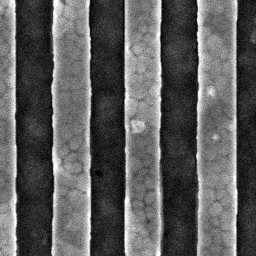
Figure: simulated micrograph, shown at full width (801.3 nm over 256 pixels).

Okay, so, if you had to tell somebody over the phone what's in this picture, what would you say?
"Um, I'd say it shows lines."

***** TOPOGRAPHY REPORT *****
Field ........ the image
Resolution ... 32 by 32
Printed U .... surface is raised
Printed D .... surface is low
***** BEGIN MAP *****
UUDDDDDUUUUDDDDDUUUUDDDDDUUUUUDD
UUDDDDDUUUUDDDDDUUUUDDDDDUUUUUDD
UUDDDDDUUUUDDDDDUUUUDDDDDUUUUUDD
UUDDDDDUUUUDDDDDUUUUDDDDDUUUUDDD
UUDDDDDUUUUDDDDDUUUUDDDDDUUUUDDD
UUDDDDDUUUUDDDDDUUUUDDDDDUUUUDDD
UUDDDDDUUUUDDDDDUUUUDDDDDUUUUDDD
UUDDDDDUUUUDDDDDUUUUDDDDDUUUUDDD
UUDDDDDUUUUDDDDDUUUUDDDDDUUUUDDD
UUDDDDDUUUUDDDDDUUUUDDDDDUUUUDDD
UUDDDDDUUUUDDDDDUUUUDDDDDUUUUDDD
UUDDDDDUUUUDDDDDUUUUDDDDDUUUUDDD
UUDDDDDUUUUDDDDDUUUUDDDDDUUUUDDD
UUDDDDDUUUUDDDDDUUUUDDDDDUUUUDDD
UUDDDDDUUUUDDDDDUUUUDDDDDUUUUDDD
UUDDDDDUUUUDDDDDUUUUDDDDDUUUUDDD
UUDDDDDUUUUDDDDDUUUUDDDDDUUUUDDD
UUDDDDDUUUUDDDDDUUUUDDDDDUUUUDDD
UUDDDDDUUUUDDDDDUUUUDDDDDUUUUDDD
UUDDDDDUUUUDDDDDUUUUDDDDDUUUUDDD
UUDDDDDUUUUDDDDDUUUUDDDDDUUUUDDD
UUDDDDDUUUUDDDDDUUUUDDDDDUUUUDDD
UUDDDDDUUUUDDDDDUUUUDDDDDUUUUDDD
UUDDDDDUUUUDDDDDUUUUDDDDDUUUUUDD
UUDDDDDUUUUDDDDDUUUUDDDDDUUUUUDD
UUDDDDDUUUUDDDDDUUUUDDDDDUUUUUDD
UUDDDDDUUUUDDDDDUUUUDDDDDUUUUUDD
UUDDDDDUUUUDDDDDUUUUDDDDDUUUUDDD
UUDDDDDUUUUDDDDDUUUUDDDDDUUUUDDD
UUDDDDDUUUUDDDDDUUUUDDDDDUUUUDDD
UUDDDDDUUUUDDDDDUUUUDDDDDUUUUDDD
UUDDDDDUUUUDDDDDUUUUDDDDDUUUUDDD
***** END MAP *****